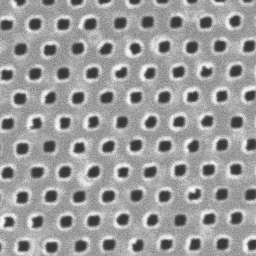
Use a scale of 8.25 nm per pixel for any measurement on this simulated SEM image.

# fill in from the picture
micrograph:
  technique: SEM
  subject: a regular array of holes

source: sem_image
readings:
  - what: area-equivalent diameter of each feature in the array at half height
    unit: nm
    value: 104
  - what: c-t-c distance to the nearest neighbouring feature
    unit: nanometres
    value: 228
